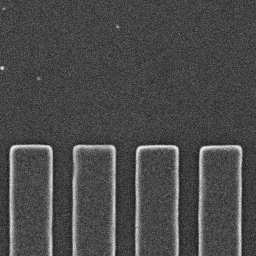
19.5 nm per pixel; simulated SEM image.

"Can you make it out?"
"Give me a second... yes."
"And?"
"wiring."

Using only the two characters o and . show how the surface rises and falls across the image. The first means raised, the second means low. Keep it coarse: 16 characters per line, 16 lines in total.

................
................
................
................
................
................
................
................
................
.oo..oo..oo..oo.
.oo..oo..oo..oo.
.oo..oo..oo..oo.
.oo..oo..oo.ooo.
.oo..oo..oo.ooo.
.oo..oo..oo.ooo.
.oo..oo..oo.ooo.